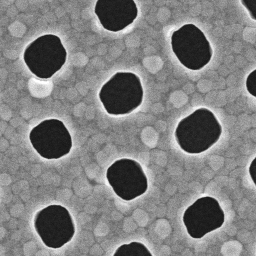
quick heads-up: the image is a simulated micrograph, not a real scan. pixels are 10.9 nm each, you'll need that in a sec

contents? a regular array of holes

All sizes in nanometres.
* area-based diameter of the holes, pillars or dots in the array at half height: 448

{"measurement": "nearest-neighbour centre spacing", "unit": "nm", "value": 920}